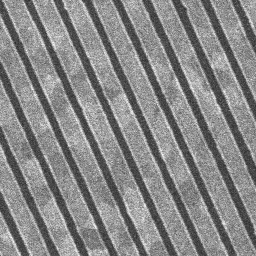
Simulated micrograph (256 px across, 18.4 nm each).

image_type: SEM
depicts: parallel lines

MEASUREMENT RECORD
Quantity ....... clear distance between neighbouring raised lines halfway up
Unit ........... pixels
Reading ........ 10.2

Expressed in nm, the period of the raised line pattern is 495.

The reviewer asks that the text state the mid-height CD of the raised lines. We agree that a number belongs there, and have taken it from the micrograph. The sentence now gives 310 nm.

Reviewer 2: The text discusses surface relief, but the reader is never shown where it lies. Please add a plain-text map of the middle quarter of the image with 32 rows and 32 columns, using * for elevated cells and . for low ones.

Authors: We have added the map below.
****...*****...****...*****..***
*****...****...*****...****...**
.****...*****..*****...****...**
.*****...****...*****..*****...*
..****...****...*****...****...*
..*****...****...*****..*****...
..*****...****...*****...****...
...*****..*****...****...*****..
*..*****...****...*****...****..
*...*****..*****...****...*****.
**..*****...****...*****...****.
**...****...*****...****...*****
***..*****...****...*****..*****
***...****...*****..*****...****
****..*****...****...*****..****
****...****...*****..*****...***
****...*****...****...*****..***
*****..*****...****...*****...**
*****...*****..*****...****...**
.*****...****...****...*****...*
.*****...*****..*****...****...*
..*****..*****...****...*****...
..*****...****...*****..*****...
...****...*****...****...*****..
*..*****...****...*****..*****..
*...****...*****...****...****..
*...*****...****...*****..*****.
**...****...*****..*****...****.
**...*****..*****...****...*****
***...****...*****..*****...****
***...*****..*****...****...****
****..*****...*****..*****...***